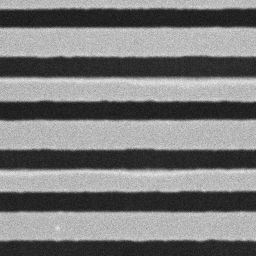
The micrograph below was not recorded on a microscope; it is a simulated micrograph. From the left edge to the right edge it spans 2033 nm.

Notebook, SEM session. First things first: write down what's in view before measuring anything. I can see lines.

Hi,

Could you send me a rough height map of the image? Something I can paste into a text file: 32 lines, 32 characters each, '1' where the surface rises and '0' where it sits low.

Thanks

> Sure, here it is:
11111111111111111111111111111111
00000000000000000000000000000000
00000000000000000000000000000000
00000000000000000000100010110110
11111111111111111111111111111111
11111111111111111111111111111111
11111111111111111111111111111111
00000000000000000000000000000000
00000000000000000000000000000000
00000000000000000000000000000000
11111111111111111111111111111111
11111111111111111111111111111111
11111011111111111111111111111111
00000000000000000000000000000000
00000000000000000000000000000000
11111111111111111111111111111111
11111111111111111111111111111111
11111111111111111111111111111111
11111111111111111111111111111111
00000000000000000000000000000000
00000000000000000000000000000000
11111111111111111111111111111111
11111111111111111111111111111111
11111111111111111111111111111111
00000000000000000000000000000000
00000000000000000000000000000000
00000000000000000000000000000000
11111111111111111111111111111111
11111111111111111111111111111111
11111111111111111111111111111111
00000000000000000000000000000000
00000000000000000000000000000000